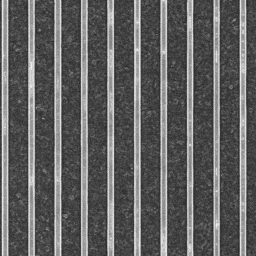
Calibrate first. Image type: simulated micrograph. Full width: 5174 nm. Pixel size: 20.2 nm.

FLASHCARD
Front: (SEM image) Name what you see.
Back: parallel lines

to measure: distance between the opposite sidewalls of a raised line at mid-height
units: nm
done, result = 101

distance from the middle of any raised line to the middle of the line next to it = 535 nm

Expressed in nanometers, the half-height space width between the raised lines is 434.